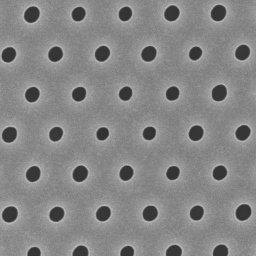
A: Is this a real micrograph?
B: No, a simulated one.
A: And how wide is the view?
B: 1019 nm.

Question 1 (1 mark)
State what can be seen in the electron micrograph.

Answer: a regular array of holes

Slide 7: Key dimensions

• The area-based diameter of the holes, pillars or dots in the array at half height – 60.3 nanometres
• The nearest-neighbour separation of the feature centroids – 0.183 µm